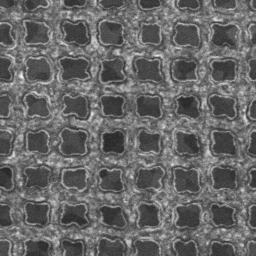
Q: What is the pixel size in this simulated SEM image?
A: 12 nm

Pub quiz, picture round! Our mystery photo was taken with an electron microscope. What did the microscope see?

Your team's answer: a regular array of raised bodies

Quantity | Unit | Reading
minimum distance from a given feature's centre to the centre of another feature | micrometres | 0.426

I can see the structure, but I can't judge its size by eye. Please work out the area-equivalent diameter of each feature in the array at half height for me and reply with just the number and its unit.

309 nm